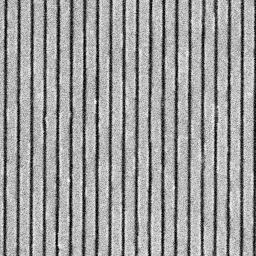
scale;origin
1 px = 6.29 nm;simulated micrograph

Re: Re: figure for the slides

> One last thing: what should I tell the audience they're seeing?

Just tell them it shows parallel lines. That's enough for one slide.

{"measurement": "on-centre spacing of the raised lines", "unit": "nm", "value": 82.7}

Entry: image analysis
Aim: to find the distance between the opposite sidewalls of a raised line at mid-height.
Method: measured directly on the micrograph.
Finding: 59.7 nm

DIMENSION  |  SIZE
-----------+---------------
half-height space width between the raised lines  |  21.2 nm